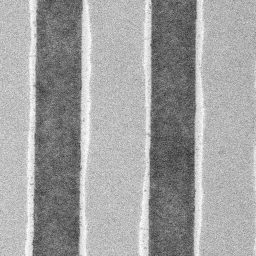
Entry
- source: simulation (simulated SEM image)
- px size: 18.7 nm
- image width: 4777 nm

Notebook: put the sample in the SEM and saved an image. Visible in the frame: lines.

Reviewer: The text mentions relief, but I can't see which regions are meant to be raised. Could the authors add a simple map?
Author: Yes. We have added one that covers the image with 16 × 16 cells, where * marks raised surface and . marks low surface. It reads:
**...****....***
**...****....***
**...****...****
**...****...****
**...****...****
**...****...****
**...****...****
**...****...****
**...****...****
**...****...****
**...****...****
**...****...****
**...****...****
**...****...****
**...****...****
**...****...****